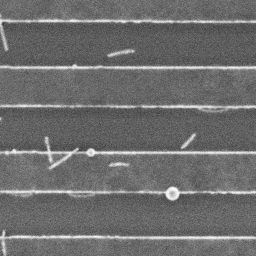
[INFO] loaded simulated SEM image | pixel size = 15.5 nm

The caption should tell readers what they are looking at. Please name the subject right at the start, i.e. lines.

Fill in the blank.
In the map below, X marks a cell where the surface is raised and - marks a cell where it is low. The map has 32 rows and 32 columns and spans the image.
XXXXXXXXXXXXXXXXXXXXXXXXXXXXXXXX
XXXXXXXXXXXXXXXXXXXXXXXXXXXXXXXX
XXXXXXXXXXXXXXXXXXXXXXXXXXXXXXXX
--------------------------------
--------------------------------
--------------------------------
--------------------------------
--------------------------------
XXXXXXXXXXXXXXXXXXXXXXXXXXXXXXXX
XXXXXXXXXXXXXXXXXXXXXXXXXXXXXXXX
XXXXXXXXXXXXXXXXXXXXXXXXXXXXXXXX
XXXXXXXXXXXXXXXXXXXXXXXXXXXXXXXX
XXXXXXXXXXXXXXXXXXXXXXXXXXXXXXXX
--------------------------------
--------------------------------
--------------------------------
--------------------------------
--------------------------------
--------------------------------
XXXXXXXXXXXXXXXXXXXXXXXXXXXXXXXX
XXXXXXXXXXXXXXXXXXXXXXXXXXXXXXXX
XXXXXXXXXXXXXXXXXXXXXXXXXXXXXXXX
XXXXXXXXXXXXXXXXXXXXXXXXXXXXXXXX
XXXXXXXXXXXXXXXXXXXXXXXXXXXXXXXX
---------------------X----------
--------------------------------
--------------------------------
--------------------------------
--------------------------------
--------------------------------
XXXXXXXXXXXXXXXXXXXXXXXXXXXXXXXX
XXXXXXXXXXXXXXXXXXXXXXXXXXXXXXXX